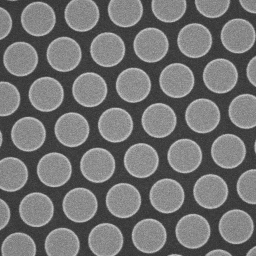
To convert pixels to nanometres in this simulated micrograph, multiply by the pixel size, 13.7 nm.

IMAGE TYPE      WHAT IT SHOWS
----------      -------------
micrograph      an array of small figures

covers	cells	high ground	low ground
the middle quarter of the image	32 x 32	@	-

@@@-------@@--------------@@@@--
@@--------------@@@------@@@@@@@
-----@@@------@@@@@@@---@@@@@@@@
---@@@@@@----@@@@@@@@---@@@@@@@@
---@@@@@@@---@@@@@@@@@--@@@@@@@@
--@@@@@@@@@--@@@@@@@@@--@@@@@@@@
--@@@@@@@@@--@@@@@@@@----@@@@@@@
--@@@@@@@@@---@@@@@@@----@@@@@@-
---@@@@@@@----@@@@@@------------
---@@@@@@--------@--------------
-----@@@-------------@@@@@-----@
-----------@@@@-----@@@@@@@----@
@@@@------@@@@@@----@@@@@@@@--@@
@@@@@----@@@@@@@@---@@@@@@@@--@@
@@@@@@---@@@@@@@@--@@@@@@@@@---@
@@@@@@---@@@@@@@@---@@@@@@@@---@
@@@@@@---@@@@@@@@---@@@@@@@-----
@@@@@@---@@@@@@@@----@@@@@------
@@@@@@----@@@@@@----------------
@@@@@-------@@--------------@@@@
-@@--------------@@@@@-----@@@@@
-------@@@------@@@@@@@---@@@@@@
-----@@@@@@@---@@@@@@@@---@@@@@@
@----@@@@@@@---@@@@@@@@---@@@@@@
@---@@@@@@@@@--@@@@@@@@---@@@@@@
@@--@@@@@@@@@--@@@@@@@@----@@@@@
@@--@@@@@@@@@---@@@@@@@-----@@@@
@@---@@@@@@@-----@@@@@----------
@----@@@@@@---------------------
@-------@--------------@@@@@----
------------@@@@@-----@@@@@@@---
--@@@@-----@@@@@@@----@@@@@@@@--